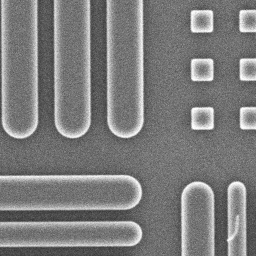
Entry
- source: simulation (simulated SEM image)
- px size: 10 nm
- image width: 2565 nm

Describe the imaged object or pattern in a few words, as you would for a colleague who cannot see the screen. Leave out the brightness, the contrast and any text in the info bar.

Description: groups of lines, slits or small figures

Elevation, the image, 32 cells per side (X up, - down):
XXXXX--XXXX--XXXXX--------------
XXXXX--XXXX--XXXXX------XX----XX
XXXXX--XXXX--XXXXX------XX----XX
XXXXX--XXXX--XXXXX------XX----XX
XXXXX--XXXX--XXXXX--------------
XXXXX--XXXX--XXXXX--------------
XXXXX--XXXX--XXXXX--------------
XXXXX--XXXX--XXXXX------XX----XX
XXXXX--XXXX--XXXXX------XX----XX
XXXXX--XXXX---XXXX------XX----XX
XXXXX--XXXX---XXXX--------------
XXXXX--XXXX---XXXX--------------
XXXXX--XXXX---XXXX--------------
XXXXX--XXXX---XXXX-------------X
XXXXX--XXXX---XXXX------XXX---XX
XXXXX--XXXX---XXXX------XXX---XX
-XXX----XXX---XXX---------------
--------------------------------
--------------------------------
--------------------------------
--------------------------------
--------------------------------
XXXXXXXXXXXXXXXXX---------------
XXXXXXXXXXXXXXXXXX-----XXX---XX-
XXXXXXXXXXXXXXXXXX-----XXXX--XX-
XXXXXXXXXXXXXXXXX------XXXX--XX-
-----------------------XXXX--XX-
-----------------------XXXX--XX-
XXXXXXXXXXXXXXXXX------XXXX--XX-
XXXXXXXXXXXXXXXXXX-----XXXX--XX-
XXXXXXXXXXXXXXXXX------XXXX--XX-
-----------------------XXXX--XX-